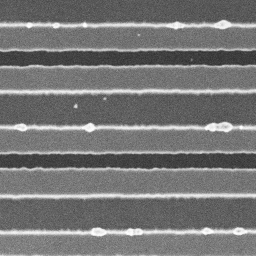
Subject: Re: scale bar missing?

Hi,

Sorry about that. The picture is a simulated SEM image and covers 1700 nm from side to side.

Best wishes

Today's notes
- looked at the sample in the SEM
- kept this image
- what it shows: lines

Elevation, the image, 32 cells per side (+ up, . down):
................................
................................
................................
++++++++++++++++++++++++++++++++
++++++++++++++++++++++++++++++++
++++++++++++++++++++++++++++++++
................................
................................
++++++++++++++++++++++++++++++++
++++++++++++++++++++++++++++++++
++++++++++++++++++++++++++++++++
................................
................................
................................
................................
..........................+++...
++++++++++++++++++++++++++++++++
++++++++++++++++++++++++++++++++
++++++++++++++++++++++++++++++++
................................
................................
++++++++++++++++++++++++++++++++
++++++++++++++++++++++++++++++++
++++++++++++++++++++++++++++++++
.++...++........................
................................
................................
................................
................................
++++++++++++++++++++++++++++++++
++++++++++++++++++++++++++++++++
++++++++++++++++++++++++++++++++